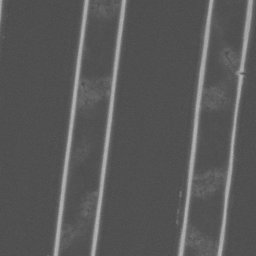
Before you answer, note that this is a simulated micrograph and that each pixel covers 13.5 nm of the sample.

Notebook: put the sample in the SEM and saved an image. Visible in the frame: one or a few lines or trenches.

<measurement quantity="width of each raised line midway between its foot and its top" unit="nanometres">514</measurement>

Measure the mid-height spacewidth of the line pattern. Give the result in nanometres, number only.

1170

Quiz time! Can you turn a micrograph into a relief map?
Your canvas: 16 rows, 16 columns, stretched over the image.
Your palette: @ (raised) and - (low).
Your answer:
-----@@@-----@@@
-----@@@-----@@@
-----@@------@@-
-----@@------@@-
-----@@------@@-
-----@@------@@-
-----@@-----@@@-
----@@@-----@@@-
----@@@-----@@@-
----@@@-----@@@-
----@@------@@--
----@@------@@--
----@@------@@--
----@@------@@--
----@@-----@@@--
----@@-----@@@--